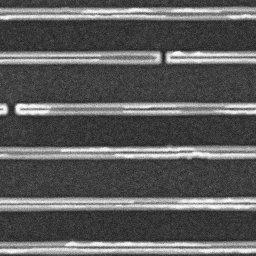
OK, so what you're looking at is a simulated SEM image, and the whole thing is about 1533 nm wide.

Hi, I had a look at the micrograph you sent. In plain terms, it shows parallel lines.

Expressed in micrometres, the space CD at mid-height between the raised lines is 0.208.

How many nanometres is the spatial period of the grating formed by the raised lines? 280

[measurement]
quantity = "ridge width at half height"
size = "9.37 px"